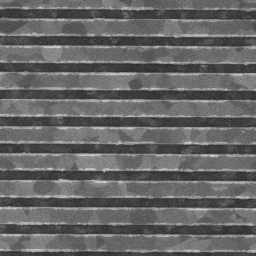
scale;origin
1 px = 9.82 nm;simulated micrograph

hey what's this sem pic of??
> parallel lines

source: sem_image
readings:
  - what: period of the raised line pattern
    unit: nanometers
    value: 264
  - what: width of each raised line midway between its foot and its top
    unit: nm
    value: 164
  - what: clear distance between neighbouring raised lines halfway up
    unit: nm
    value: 99.4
